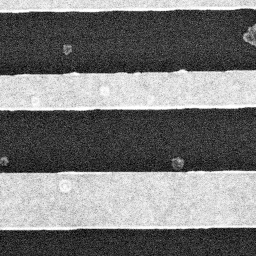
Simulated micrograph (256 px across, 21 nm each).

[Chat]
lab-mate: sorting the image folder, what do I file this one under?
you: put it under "lines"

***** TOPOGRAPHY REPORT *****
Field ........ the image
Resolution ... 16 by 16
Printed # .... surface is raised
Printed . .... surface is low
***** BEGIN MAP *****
##############..
................
................
................
...........#..##
################
################
................
................
................
................
################
################
################
................
................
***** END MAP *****